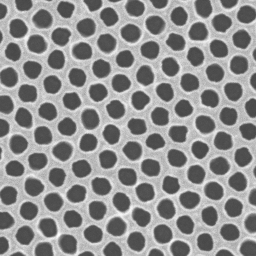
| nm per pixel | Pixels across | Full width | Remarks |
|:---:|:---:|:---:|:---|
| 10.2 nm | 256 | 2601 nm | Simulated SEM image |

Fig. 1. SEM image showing a regular array of holes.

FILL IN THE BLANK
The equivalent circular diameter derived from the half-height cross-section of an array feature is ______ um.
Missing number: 0.19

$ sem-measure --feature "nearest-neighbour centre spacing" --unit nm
249